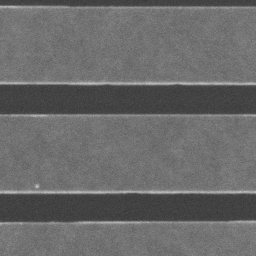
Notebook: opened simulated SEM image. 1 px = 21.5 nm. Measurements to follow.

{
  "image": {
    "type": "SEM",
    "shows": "lines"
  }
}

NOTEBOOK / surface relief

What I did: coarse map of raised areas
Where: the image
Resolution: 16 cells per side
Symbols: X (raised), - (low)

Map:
XXXXXXXXXXXXXXXX
XXXXXXXXXXXXXXXX
XXXXXXXXXXXXXXXX
XXXXXXXXXXXXXXXX
XXXXXXXXXXXXXXXX
----------------
----------------
XXXXXXXXXXXXXXXX
XXXXXXXXXXXXXXXX
XXXXXXXXXXXXXXXX
XXXXXXXXXXXXXXXX
XXXXXXXXXXXXXXXX
----------------
----------------
XXXXXXXXXXXXXXXX
XXXXXXXXXXXXXXXX